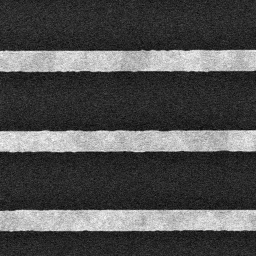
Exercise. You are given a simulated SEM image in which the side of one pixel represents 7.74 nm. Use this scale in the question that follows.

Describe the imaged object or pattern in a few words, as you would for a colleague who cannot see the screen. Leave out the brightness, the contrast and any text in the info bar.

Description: lines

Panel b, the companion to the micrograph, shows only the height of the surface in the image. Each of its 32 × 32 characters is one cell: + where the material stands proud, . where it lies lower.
................................
................................
................................
................................
................................
................................
++++++++++++++++++++++++++++++++
++++++++++++++++++++++++++++++++
++++++++++++++++++++++++++++++++
................................
................................
................................
................................
................................
................................
................................
++++++++++++++++++++++++++++++++
++++++++++++++++++++++++++++++++
++++++++++++++++++++++++++++++++
................................
................................
................................
................................
................................
................................
................................
++++++++++++++++++++++++++++++++
++++++++++++++++++++++++++++++++
++++++++++++++++++++++++++++++++
................................
................................
................................